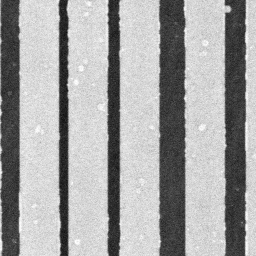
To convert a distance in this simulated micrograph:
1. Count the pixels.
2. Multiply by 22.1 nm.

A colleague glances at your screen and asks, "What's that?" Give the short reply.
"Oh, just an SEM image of lines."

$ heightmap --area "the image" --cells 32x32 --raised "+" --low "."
...++++..++++..+++++...+++++...+
...++++..++++..+++++...+++++...+
..+++++..++++..+++++...+++++...+
..+++++..++++..+++++...+++++...+
..+++++..++++..+++++...+++++...+
...++++..++++..+++++...+++++...+
...++++..++++..+++++...+++++...+
...++++..++++..+++++...+++++...+
...++++..++++..+++++...+++++...+
..+++++..++++..+++++...+++++...+
...++++..++++..+++++...+++++...+
...++++..++++..+++++...+++++...+
...++++..++++..+++++...+++++...+
...++++..++++..+++++...+++++...+
...++++..++++..+++++...+++++...+
...++++..++++..+++++...+++++...+
...++++..++++..+++++...+++++...+
...++++..++++..+++++...+++++...+
...++++..++++..+++++...+++++...+
...++++..++++..+++++...+++++...+
...++++..++++..+++++...+++++...+
...++++..++++..+++++...+++++...+
...++++..++++..+++++...+++++...+
...++++..++++..+++++...+++++...+
...++++..++++..+++++...+++++...+
...++++..++++..+++++...+++++...+
...++++..++++..+++++...+++++...+
...++++..++++..+++++...+++++...+
...++++..++++..+++++...+++++...+
...++++..++++..+++++...+++++...+
...++++..++++..+++++...+++++...+
...++++..++++..+++++...+++++...+